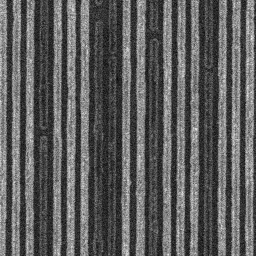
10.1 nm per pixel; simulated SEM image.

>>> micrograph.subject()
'parallel lines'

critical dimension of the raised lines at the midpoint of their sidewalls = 0.059 µm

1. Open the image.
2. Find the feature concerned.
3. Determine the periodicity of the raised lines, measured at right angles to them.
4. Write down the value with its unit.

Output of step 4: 0.138 micrometres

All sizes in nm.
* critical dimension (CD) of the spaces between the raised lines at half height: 79.1